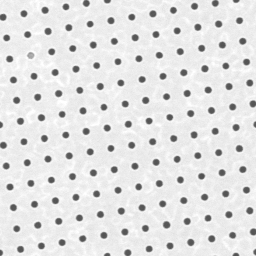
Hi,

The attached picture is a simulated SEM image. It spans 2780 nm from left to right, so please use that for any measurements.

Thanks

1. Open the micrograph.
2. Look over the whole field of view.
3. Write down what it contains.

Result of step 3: a regular array of holes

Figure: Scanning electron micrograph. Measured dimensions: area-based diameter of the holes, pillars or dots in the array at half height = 80.4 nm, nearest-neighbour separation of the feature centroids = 226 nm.